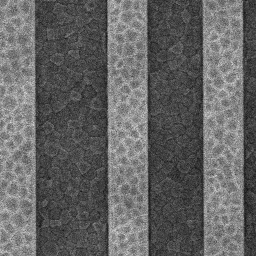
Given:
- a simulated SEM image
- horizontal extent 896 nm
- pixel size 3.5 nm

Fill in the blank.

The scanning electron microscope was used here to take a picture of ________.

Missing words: one or a few lines or trenches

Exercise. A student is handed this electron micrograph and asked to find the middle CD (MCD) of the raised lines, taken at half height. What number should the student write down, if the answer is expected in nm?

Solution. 134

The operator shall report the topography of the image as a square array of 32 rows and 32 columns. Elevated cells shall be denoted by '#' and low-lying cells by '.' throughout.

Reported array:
####..........####.......#####..
####..........####.......#####..
####..........####.......#####..
####..........####.......#####..
####..........####.......#####..
####..........####.......#####..
####..........####.......#####..
####..........####........####..
####..........####........####..
####..........####........####..
####..........####........####..
####..........####........####..
####..........####........####..
####..........####........####..
####..........####........####..
####..........####........####..
####..........####........####..
####..........####........####..
####..........####........####..
####..........####........####..
####..........####........####..
####..........####........####..
####..........####........####..
####..........####........####..
####..........####........####..
####..........####........####..
####..........####........####..
####..........####........####..
####..........####........####..
####..........####........####..
####..........####........####..
####..........####........####..